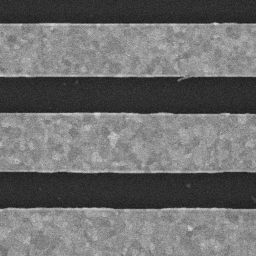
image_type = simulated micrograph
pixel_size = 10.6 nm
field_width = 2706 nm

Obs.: lines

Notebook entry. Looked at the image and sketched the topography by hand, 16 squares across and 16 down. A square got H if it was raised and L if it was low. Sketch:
LLLLLLLLLLLLLLLL
LLLLLLLLLLLLLLLL
HHHHHHHHHHHHHHHH
HHHHHHHHHHHHHHHH
HHHHHHHHHHHHHHHH
LLLLLLLLLLLLLLLL
LLLLLLLLLLLLLLLL
HHHHHHHHHHHHHHHH
HHHHHHHHHHHHHHHH
HHHHHHHHHHHHHHHH
HHHHHHHHHHHHHHHH
LLLLLLLLLLLLLLLL
LLLLLLLLLLLLLLLL
HHHHHHHHHHHHHHHH
HHHHHHHHHHHHHHHH
HHHHHHHHHHHHHHHH